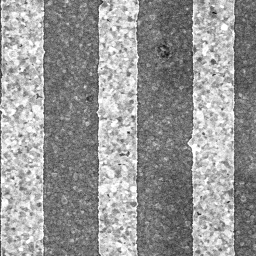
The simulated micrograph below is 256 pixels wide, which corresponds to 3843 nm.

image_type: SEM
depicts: one or a few lines or trenches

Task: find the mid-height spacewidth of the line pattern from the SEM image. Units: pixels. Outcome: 55.9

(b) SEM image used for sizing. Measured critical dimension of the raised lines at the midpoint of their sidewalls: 554 nm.